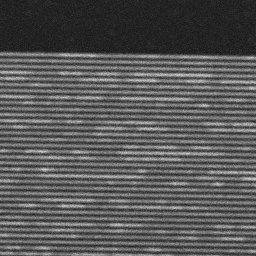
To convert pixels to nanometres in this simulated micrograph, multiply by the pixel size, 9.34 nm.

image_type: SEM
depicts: parallel lines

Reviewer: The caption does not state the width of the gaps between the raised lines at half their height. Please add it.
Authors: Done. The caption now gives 43.2 nm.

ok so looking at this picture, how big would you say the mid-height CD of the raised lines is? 12.8 nm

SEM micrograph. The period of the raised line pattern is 56.3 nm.